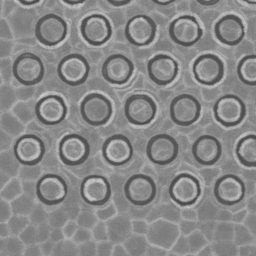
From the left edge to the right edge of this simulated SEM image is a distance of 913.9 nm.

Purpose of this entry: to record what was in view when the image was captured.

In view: a regular array of ring-shaped grooves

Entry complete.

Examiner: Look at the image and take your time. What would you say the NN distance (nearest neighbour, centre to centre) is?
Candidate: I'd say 158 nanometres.